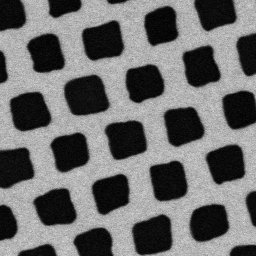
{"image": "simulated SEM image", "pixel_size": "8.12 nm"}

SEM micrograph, a regular array of holes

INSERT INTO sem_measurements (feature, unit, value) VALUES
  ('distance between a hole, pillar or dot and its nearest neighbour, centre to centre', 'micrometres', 0.463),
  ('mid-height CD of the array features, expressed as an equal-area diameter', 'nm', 313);